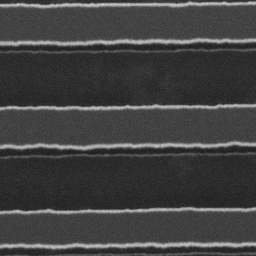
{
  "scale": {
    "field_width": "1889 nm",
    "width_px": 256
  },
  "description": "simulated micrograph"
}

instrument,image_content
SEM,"lines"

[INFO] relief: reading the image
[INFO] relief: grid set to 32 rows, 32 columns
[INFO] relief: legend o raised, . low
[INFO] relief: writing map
..o.....ooo.oooooooooooooooooooo
oooooooooooooooooooooooooooooooo
oooooooooooooooooooooooooooooooo
oooooooooooooooooooooooooooooooo
oooooooooooooooooooooooooooooooo
ooo....oooo.....................
................................
................................
................................
................................
................................
................................
................................
oooooooooooooooooooooooooooooooo
oooooooooooooooooooooooooooooooo
oooooooooooooooooooooooooooooooo
oooooooooooooooooooooooooooooooo
oooooooooooooooooooooooooooooooo
o.oo...ooooo....................
................................
................................
................................
................................
................................
................................
................................
oooooooooooooooooooooooooooooooo
oooooooooooooooooooooooooooooooo
oooooooooooooooooooooooooooooooo
oooooooooooooooooooooooooooooooo
oooooooooooooooooooooooooooooooo
................................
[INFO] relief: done